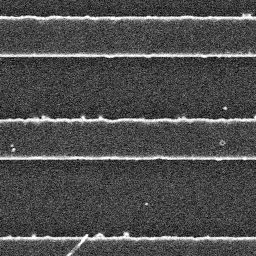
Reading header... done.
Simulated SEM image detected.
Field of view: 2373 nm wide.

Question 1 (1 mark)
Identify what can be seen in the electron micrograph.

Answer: lines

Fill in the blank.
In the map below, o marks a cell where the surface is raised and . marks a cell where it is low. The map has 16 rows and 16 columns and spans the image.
................
oooooooooooooooo
oooooooooooooooo
............o...
................
................
................
ooooo.ooo.ooo..o
oooooooooooooooo
oooooooooooooooo
................
................
................
................
................
oooooooooooooooo